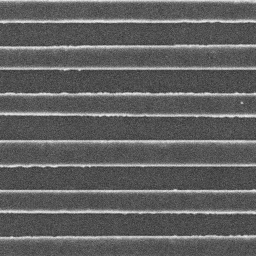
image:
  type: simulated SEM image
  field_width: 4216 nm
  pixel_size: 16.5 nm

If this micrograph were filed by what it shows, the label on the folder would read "lines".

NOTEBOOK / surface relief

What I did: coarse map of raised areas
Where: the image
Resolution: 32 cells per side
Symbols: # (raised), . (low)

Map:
################################
################################
################################
................................
................................
................................
################################
################################
################################
................................
................................
................................
################################
################################
...........................#....
................................
................................
................................
################################
################################
################################
................................
................................
................................
################################
################################
################################
................................
................................
...............................#
################################
################################